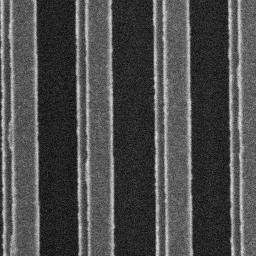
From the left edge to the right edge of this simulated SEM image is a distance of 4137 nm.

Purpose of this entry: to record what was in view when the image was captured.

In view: lines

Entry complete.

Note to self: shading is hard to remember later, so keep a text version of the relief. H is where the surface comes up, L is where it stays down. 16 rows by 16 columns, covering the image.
HHLLLHHLLLHHLLHH
HHLLLHHLLLHHLLHH
HHLLLHHLLLHHLLHH
HHLLLHHLLLHHLLHH
HHLLLHHLLLHHLLHH
HHLLLHHLLLHHLLHH
HHLLLHHLLLHHLLHH
HHLLLHHLLLHHLLHH
HHLLLHHLLLHHLLHH
HHLLLHHLLLHHLLHH
HHLLLHHLLLHHLLHH
HHLLLHHLLLHHLLHH
HHLLLHHLLLHHLLHH
HHLLLHHLLLHHLLHH
HHLLLHHLLLHHLLLH
HHLLLHHLLLHHLLLH